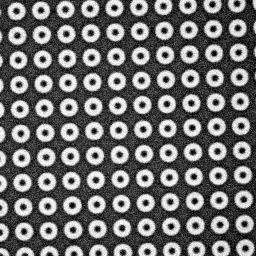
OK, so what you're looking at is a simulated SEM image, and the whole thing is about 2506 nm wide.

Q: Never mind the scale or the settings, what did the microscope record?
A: an array of small figures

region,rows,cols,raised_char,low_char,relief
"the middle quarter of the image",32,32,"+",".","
++..............................
................................
............++....+++...+++...++
+++..++++..++++..++++..+++++.+++
+++..++++..++++..++++..+++++..++
+++..++++..++++...+++...+++...++
++....++........................
................................
.............+....+++...+++...++
+++...+++...+++...++++..++++..++
+++..++++..+++++.+++++..++++..++
+++..++++...+++...+++...+++...++
+++...+++.......................
................................
...................++....++...++
+++...+++...++++..++++..++++..++
+++..+++++..++++..++++..++++..++
++++.+++++..++++..++++..++++...+
+++...+++....++.................
................................
...................++....++....+
+++...+++...++++..++++..++++..++
++++..++++..++++..++++..++++..++
++++..++++..++++..++++..++++...+
+++...+++....++....++...........
................................
.........................++....+
.++...+++...++++..++++..++++..++
++++..++++..++++..++++..++++..++
++++..++++..++++..++++...+++...+
++++..++++...++....++.....+.....
................................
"